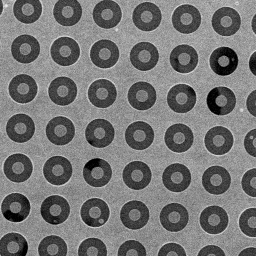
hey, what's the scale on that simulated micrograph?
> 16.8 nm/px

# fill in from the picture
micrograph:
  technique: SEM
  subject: an array of small figures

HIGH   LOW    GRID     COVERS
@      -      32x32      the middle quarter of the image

-@@@@@@@----@@@@@------@@@@-----
@@@@@@@@@@@@@@@@@@@---@@@@@@----
@@@@@@@@@@@@@@@@@@@@@@@@@@@@@@@@
--@@@@@@@@@@@@@@@@@@@@@@@@@@@@@@
---@@@@-----@@@@@@---@@@@@@@@@@@
---@@@-------@@@@-----@@@@@-----
---@@@-------@@@-------@@@------
---@@@-------@@@-------@@@------
---@@@-------@@@-------@@@------
--@@@@-------@@@-------@@@------
@@@@@@@-----@@@@@-----@@@@------
@@@@@@@@@@@@@@@@@@---@@@@@@-----
@@@@@@@@@@@@@@@@@@@@@@@@@@@@@@@@
-@@@@@@@@@@@@@@@@@@@@@@@@@@@@@@@
--@@@@@----@@@@@@---@@@@@@@@@@@@
---@@@------@@@@------@@@@@----@
---@@--------@@-------@@@@------
---@@--------@@--------@@---@@--
--@@@-------@@@--------@@---@@--
--@@@@------@@@-------@@@---@@--
@@@@@@@----@@@@@------@@@@------
@@@@@@@@@@@@@@@@@@--@@@@@@-----@
@@@@@@@@@@@@@@@@@@@@@@@@@@@@@@@@
-@@@@@@@-@@@@@@@@@@@@@@@@@@@@@@@
--@@@@-----@@@@@@---@@@@@@@@@@@@
--@@@-------@@@------@@@@@----@@
--@@@-------@@@-------@@@------@
--@@@-------@@@-------@@@-------
--@@@-------@@@-------@@--------
-@@@@------@@@@-------@@@-------
@@@@@@@---@@@@@@-----@@@@------@
@@@@@@@@@@@@@@@@@@-@@@@@@@----@@